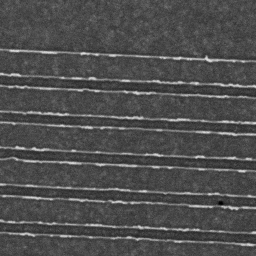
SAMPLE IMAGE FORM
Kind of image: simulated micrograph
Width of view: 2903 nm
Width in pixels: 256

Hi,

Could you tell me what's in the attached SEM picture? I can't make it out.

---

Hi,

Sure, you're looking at parallel lines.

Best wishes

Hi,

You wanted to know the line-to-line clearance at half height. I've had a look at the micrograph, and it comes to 0.122 um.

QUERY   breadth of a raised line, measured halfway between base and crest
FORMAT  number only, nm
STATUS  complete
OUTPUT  299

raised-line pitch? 415 nm